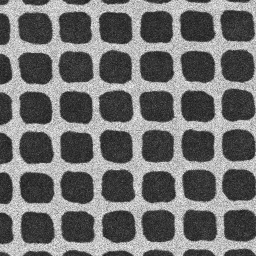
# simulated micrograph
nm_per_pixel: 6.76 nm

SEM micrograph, a regular array of holes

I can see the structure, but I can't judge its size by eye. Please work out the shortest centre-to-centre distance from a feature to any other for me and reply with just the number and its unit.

268 nm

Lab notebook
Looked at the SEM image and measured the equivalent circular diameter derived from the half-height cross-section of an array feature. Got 233 nm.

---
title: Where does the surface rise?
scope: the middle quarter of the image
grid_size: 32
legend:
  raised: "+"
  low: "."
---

.......++........++........++...
.......++........++........++...
.......++........++........+++..
.......++........+++.......+++..
......+++++.....+++++....+++++++
++++++++++++++++++++++++++++++++
+++++++++++++.++++++++++++++++++
......++++......+++........+++..
.......++........++........++...
.......++........++.........+...
.......++........++.........+...
.......++........++.........+...
.......++........++.........++..
.......+++.......+++.......+++..
+.....+++++.....+++++++++.+++++.
++++++++++++++++++++++++++++++++
+++++++++++.++++++++++..+++++++.
......+++.......++++.......+++..
.......++........+++.......++...
.......++........+++........+...
.......++........+++.......++...
.......++........+++.......++...
.......++........++........++...
.......+++.......+++.......+++..
+.....++++++....+++++...++++++++
++++++++++++++++++++++++++++++++
+++++++++++....++++++++++++++++.
......++++.......+++.......+++..
.......+++.......+++.......+++..
.......++........+++........++..
.......+++.......+++........++..
.......+++.......++.........++..